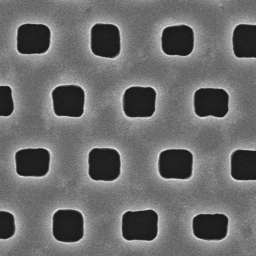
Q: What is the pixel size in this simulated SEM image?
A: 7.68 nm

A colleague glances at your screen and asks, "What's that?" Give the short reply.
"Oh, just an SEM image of a regular array of holes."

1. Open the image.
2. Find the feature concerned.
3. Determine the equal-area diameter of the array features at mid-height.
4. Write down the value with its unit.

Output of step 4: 260 nm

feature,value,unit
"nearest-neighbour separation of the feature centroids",543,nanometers